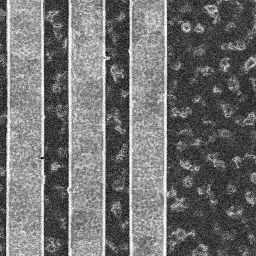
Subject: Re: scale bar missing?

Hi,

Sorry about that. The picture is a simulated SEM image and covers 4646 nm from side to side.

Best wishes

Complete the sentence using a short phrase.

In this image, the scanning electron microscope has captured parallel lines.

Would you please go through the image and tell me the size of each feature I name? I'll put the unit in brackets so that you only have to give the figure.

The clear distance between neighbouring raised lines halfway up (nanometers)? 483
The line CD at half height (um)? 0.633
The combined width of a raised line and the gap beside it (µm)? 1.11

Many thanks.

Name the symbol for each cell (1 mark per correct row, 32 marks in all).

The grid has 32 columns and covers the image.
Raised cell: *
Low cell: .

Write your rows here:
.****....****...*****...........
.****....****...*****...........
.****....****...*****...........
.****....****...*****...........
.****....****...*****...........
.****....****...*****...........
.****....****...*****...........
.****....****...*****...........
.****....****...*****...........
.****....****...*****...........
.****....****...*****...........
.****....****...*****...........
.****....****...*****...........
.****....****...*****...........
.****....****...*****...........
.****....****...*****...........
.****....****...*****...........
.****....****...*****...........
.****....****...*****...........
.****....****...*****...........
.****....****...*****...........
.****....****...*****...........
.*****...****...*****...........
.****....****...*****...........
.****....****...*****...........
.****....****...*****...........
.****....****...*****...........
.****....****...*****...........
.****....****...*****...........
.****....****...*****...........
.****....****...*****...........
.****....****...*****...........